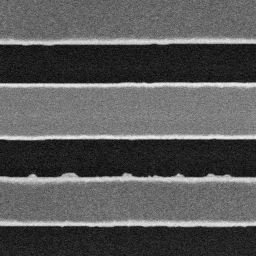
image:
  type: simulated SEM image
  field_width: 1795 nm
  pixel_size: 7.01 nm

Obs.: lines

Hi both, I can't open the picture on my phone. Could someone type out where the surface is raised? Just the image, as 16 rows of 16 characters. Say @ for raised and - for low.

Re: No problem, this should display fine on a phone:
@@@@@@@@@@@@@@@@
@@@@@@@@@@@@@@@@
@@@@@@@@@@@@@@@@
----------------
----------------
@@@@@@@@@@@@@@@@
@@@@@@@@@@@@@@@@
@@@@@@@@@@@@@@@@
@@@@@@@@@@@@@@@@
----------------
----------------
@@@@@@@@@@@@@@@@
@@@@@@@@@@@@@@@@
@@@@@@@@@@@@@@@@
----------------
----------------